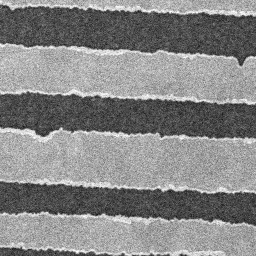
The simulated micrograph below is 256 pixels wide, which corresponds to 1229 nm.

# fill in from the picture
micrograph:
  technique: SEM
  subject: one or a few lines or trenches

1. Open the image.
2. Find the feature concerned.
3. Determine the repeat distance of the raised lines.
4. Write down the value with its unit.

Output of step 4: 392 nanometres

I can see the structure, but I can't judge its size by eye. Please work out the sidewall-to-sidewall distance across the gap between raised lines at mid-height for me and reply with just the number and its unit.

0.17 um